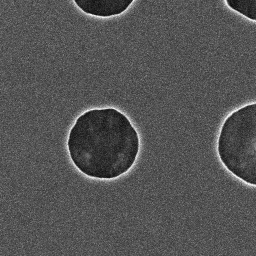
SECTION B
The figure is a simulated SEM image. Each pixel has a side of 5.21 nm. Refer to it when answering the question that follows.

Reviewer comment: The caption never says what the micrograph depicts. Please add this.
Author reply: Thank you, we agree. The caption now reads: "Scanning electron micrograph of holes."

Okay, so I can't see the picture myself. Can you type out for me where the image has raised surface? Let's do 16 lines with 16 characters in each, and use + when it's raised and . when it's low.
+++++...+++++++.
++++++++++++++++
++++++++++++++++
++++++++++++++++
++++++++++++++++
++++++++++++++++
++++++++++++++++
+++++...++++++..
++++.....+++++..
++++.....+++++..
+++++...++++++..
++++++++++++++++
++++++++++++++++
++++++++++++++++
++++++++++++++++
++++++++++++++++